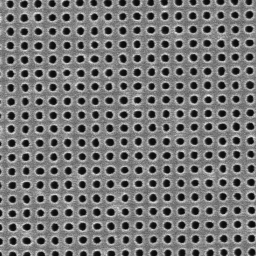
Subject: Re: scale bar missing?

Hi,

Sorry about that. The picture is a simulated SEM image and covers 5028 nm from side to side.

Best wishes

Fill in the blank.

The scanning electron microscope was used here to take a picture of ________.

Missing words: a regular array of holes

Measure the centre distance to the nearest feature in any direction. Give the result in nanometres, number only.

269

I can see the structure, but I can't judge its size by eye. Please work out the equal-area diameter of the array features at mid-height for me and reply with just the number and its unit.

152 nanometers